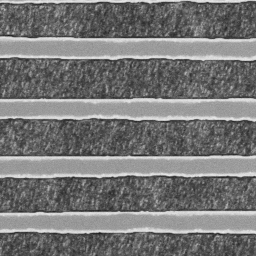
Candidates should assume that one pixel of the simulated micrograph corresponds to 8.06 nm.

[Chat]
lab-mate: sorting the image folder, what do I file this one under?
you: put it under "lines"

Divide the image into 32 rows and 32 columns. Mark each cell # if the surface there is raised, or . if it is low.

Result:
................................
................................
................................
................................
................................
################################
################################
..............................##
................................
................................
................................
................................
################################
################################
################################
................................
................................
................................
................................
................................
################################
################################
................................
................................
................................
................................
.......................#######..
################################
################################
................................
................................
................................